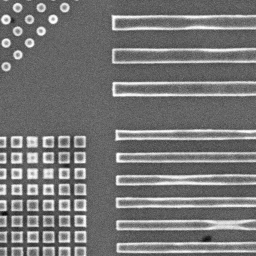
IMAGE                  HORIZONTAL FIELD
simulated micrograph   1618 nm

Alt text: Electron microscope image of groups of lines, slits or small figures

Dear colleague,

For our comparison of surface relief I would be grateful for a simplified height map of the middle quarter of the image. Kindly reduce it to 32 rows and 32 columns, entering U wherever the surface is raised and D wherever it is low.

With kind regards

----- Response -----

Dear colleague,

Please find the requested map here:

DDDDDDDDDDDDDDDDDDDDDDDDDDDDDDDD
DDDDDDDDDDDDDDDDDDDDDDDDDDDDDDDD
DDDDDDDDDDDDDDDDDDDDDDDDDDDDDDDD
DDDDDDDDDDDDDDDDDDDDDDDDDDDDDDDD
DDDDDDDDDDDDDDDDDDDDDDDDDDDDDDDD
DDDDDDDDDDDDUUUUUUUUUUUUUUUUUUUU
DDDDDDDDDDDDUUUUUUUUUUUUUUUUUUUU
DDDDDDDDDDDDUUUUUUUUUUUUUUUUUUUU
DDDDDDDDDDDDDDDDDDDDDDDDDDDDDDDD
DDDDDDDDDDDDDDDDDDDDDDDDDDDDDDDD
DDDDDDDDDDDDDDDDDDDDDDDDDDDDDDDD
DDDDDDDDDDDDDDDDDDDDDDDDDDDDDDDD
DDDDDDDDDDDDDDDDDDDDDDDDDDDDDDDD
DDDDDDDDDDDDDDDDDDDDDDDDDDDDDDDD
DDDDDDDDDDDDDDDDDDDDDDDDDDDDDDDD
DDDDDDDDDDDDDDDDDDDDDDDDDDDDDDDD
DDDDDDDDDDDDDDDDDDDDDDDDDDDDDDDD
DDDDDDDDDDDDDUUUUUUUUUUUUUUUUUUU
UDDUUDDDDDDDDUUUUUUUUUUUUUUUUUUU
UDDUUDDDDDDDDDDDDDDDDDDDDDDDDDDD
UDDUUDDDDDDDDDDDDDDDDDDDDDDDDDDD
DDDDDDDDDDDDDDDDDDDDDDDDDDDDDDDD
UDDUUDDDDDDDDDUUUUUUUUUUUUUUUUUU
UDDUUDDDDDDDDUUUUUUUUUUUUUUUUUUU
UDDUUDDDDDDDDDDDDDDDDUUUUDDDDDDD
DDDDDDDDDDDDDDDDDDDDDDDDDDDDDDDD
UDDUUDDDDDDDDDDDDDDDDDDDDDDDDDDD
UDDUUDDDDDDDDDDDDDDDDDDDDDDDDDDD
DDDDDDDDDDDDDUUUUUUUUUUUUUUUUUUU
DDDDDDDDDDDDDUUUUUUUUUUUUUUUUUUU
UDDUUDDDDDDDDDDDDDDDDDDDDDDDDDDD
UDDUUDDDDDDDDDDDDDDDDDDDDDDDDDDD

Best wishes